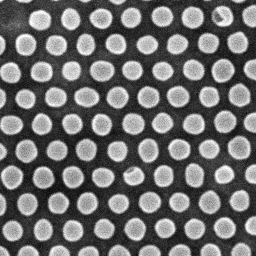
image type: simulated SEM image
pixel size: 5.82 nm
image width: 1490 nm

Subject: a regular array of raised bodies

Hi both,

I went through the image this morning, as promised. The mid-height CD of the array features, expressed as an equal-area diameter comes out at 116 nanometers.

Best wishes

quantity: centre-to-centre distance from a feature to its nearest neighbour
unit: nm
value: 172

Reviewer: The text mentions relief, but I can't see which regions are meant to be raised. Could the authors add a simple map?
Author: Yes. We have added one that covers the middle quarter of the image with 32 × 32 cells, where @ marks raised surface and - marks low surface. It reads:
@@@@---@@@@@---@@@@----@@@----@@
@@@@---@@@@@---@@@@---@@@@@---@@
@@@@---@@@@@---@@@@---@@@@@---@@
-@@----@@@@@----@@@----@@@-----@
--------------------------------
--------------------------------
----@@@-----@@@----@@@@----@@@--
---@@@@@---@@@@@---@@@@---@@@@@-
---@@@@@---@@@@@---@@@@@--@@@@@-
---@@@@@---@@@@@---@@@@@---@@@@-
-----@@-----@@@-----@@@----@@@--
--------------------------------
------------------------@-------
@@@@----@@@----@@@@----@@@@----@
@@@@---@@@@@---@@@@@--@@@@@---@@
@@@@---@@@@@---@@@@@--@@@@@---@@
@@@@----@@@----@@@@----@@@----@@
---------@-------@--------------
--------------------------------
----@@@-------------@@@----@@@--
---@@@@@---@@@@----@@@@---@@@@@-
@--@@@@@---@@@@@---@@@@---@@@@@-
@--@@@@@---@@@@@---@@@@----@@@@-
----@@@-----@@@----@@@@-----@@--
--------------------------------
------------------------@@-----@
@@@@----@@@-----@@@----@@@@----@
@@@@@--@@@@@---@@@@@---@@@@----@
@@@@@--@@@@@---@@@@@---@@@@----@
@@@@----@@@@----@@@----@@@@----@
-@@-----@@@---------------------
--------------------------------